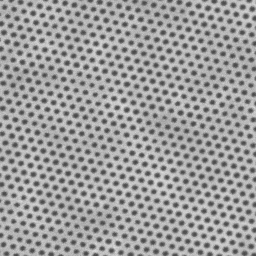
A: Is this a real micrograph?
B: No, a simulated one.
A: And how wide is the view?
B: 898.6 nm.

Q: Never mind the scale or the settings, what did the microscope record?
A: a regular array of holes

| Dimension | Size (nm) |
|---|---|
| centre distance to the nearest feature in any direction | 32.9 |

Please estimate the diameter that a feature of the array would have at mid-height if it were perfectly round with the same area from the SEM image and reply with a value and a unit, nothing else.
19.8 nanometers